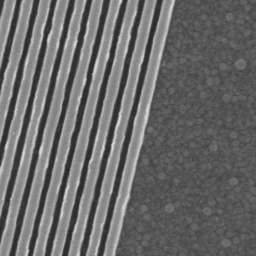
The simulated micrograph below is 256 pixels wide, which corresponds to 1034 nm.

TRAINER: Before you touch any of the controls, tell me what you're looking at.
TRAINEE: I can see parallel lines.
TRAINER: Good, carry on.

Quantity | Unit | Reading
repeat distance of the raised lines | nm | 69.2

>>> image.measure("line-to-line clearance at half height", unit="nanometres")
22.6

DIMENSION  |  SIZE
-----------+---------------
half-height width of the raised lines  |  45.2 nm